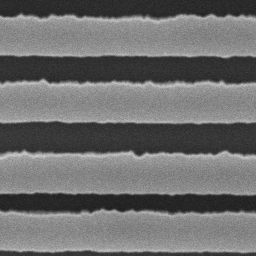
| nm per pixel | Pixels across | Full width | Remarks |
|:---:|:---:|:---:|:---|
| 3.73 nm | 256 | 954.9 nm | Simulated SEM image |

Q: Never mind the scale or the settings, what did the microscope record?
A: lines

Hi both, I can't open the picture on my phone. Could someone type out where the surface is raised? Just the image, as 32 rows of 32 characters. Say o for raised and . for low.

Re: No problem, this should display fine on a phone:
................................
................................
oooooooooooooooooooooooooooooooo
oooooooooooooooooooooooooooooooo
oooooooooooooooooooooooooooooooo
oooooooooooooooooooooooooooooooo
oooooooooooooooooooooooooooooooo
................................
................................
................................
oooooooooooooooooooo.ooooooo..oo
oooooooooooooooooooooooooooooooo
oooooooooooooooooooooooooooooooo
oooooooooooooooooooooooooooooooo
oooooooooooooooooooooooooooooooo
................................
................................
................................
................................
ooooooooooooooooo.oooooooooooooo
oooooooooooooooooooooooooooooooo
oooooooooooooooooooooooooooooooo
oooooooooooooooooooooooooooooooo
oooooooooooooooooooooooooooooooo
................................
................................
oo........o.ooo.oooo........o...
oooooooooooooooooooooooooooooooo
oooooooooooooooooooooooooooooooo
oooooooooooooooooooooooooooooooo
oooooooooooooooooooooooooooooooo
.....................o........o.